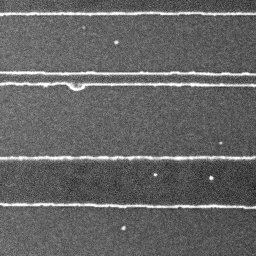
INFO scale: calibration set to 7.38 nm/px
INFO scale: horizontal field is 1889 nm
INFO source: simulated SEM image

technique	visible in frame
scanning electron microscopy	lines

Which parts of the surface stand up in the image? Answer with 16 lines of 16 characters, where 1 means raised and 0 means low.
1111111111111111
0000000000000000
0000000000000000
0000000000000000
0000000000000000
0000000000000000
0000000000000000
0000000000000000
0000000000000000
0000000000000000
1111111111111111
1111111111111111
1111111111111111
0000000000000000
0000000000000000
0000000000000000